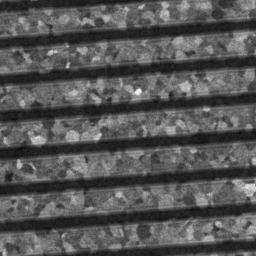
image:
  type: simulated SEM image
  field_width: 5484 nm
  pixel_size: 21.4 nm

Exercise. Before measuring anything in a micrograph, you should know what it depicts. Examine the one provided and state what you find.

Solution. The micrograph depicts parallel lines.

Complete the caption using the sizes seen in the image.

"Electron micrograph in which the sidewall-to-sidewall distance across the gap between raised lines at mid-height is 270 nm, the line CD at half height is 507 nm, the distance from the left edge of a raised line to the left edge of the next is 785 nm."